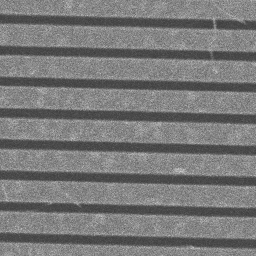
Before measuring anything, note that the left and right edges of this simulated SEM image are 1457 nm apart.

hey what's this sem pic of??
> parallel lines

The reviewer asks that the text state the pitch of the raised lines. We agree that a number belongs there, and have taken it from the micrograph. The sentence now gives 0.178 um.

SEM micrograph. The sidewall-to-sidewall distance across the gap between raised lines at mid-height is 9.37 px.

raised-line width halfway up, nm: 126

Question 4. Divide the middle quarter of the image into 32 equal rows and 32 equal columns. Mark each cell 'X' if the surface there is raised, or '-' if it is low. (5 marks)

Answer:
XXXXXXXXXXXXXXXXXXXXXXXXXXXXXXXX
XXXXXXXXXXXXXXXXXXXXXXXXXXXXXXXX
XXXXXXXXXXXXXXXXXXXXXXXXXXXXXXXX
XXXXXXXXXXXXXXXXXXXXXXXXXXXXXXXX
--------------------------------
--------------------------------
XXXXXXXXXXXXXX--XXX-------------
XXXXXXXXXXXXXXXXXXXXXXXXXXXXXXXX
XXXXXXXXXXXXXXXXXXXXXXXXXXXXXXXX
XXXXXXXXXXXXXXXXXXXXXXXXXXXXXXXX
XXXXXXXXXXXXXXXXXXXXXXXXXXXXXXXX
-----------XXXXXXXXXXXXXXXXXXXXX
--------------------------------
--------------------------------
XXXXXXXXXXXXXXXXXXX-------------
XXXXXXXXXXXXXXXXXXXXXXXXXXXXXXXX
XXXXXXXXXXXXXXXXXXXXXXXXXXXXXXXX
XXXXXXXXXXXXXXXXXXXXXXXXXXXXXXXX
XXXXXXXXXXXXXXXXXXXXXXXXXXXXXXXX
----------------XXXXXXXXXXXXXXXX
--------------------------------
--------------------------------
XXXXXXXXXXXXXXXXXXXXXXXXXXXXXXXX
XXXXXXXXXXXXXXXXXXXXXXXXXXXXXXXX
XXXXXXXXXXXXXXXXXXXXXXXXXXXXXXXX
XXXXXXXXXXXXXXXXXXXXXXXXXXXXXXXX
XXXXXXXXXXXXXXXXXXXXXXXXXXXXXXXX
---------------------XXXXXXXXXXX
--------------------------------
--------------------------------
XXXXXXXXXXXXXXXXXXXXXXXXXXXXXXXX
XXXXXXXXXXXXXXXXXXXXXXXXXXXXXXXX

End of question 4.